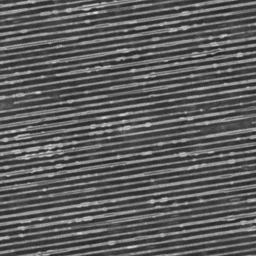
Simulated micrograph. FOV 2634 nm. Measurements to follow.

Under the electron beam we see parallel lines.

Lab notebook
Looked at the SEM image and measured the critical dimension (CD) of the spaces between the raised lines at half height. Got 0.0483 um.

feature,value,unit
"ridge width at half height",24.2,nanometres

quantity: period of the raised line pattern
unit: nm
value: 71.6